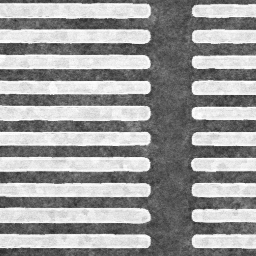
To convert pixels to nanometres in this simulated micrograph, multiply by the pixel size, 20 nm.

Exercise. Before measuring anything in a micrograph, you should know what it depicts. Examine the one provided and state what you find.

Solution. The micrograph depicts wiring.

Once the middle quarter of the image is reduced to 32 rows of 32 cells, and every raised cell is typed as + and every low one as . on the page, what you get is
+++++++++++++++++++++...........
................................
................................
................................
..........+++...................
+++++++++++++++++++++...........
+++++++++++++++++++++...........
................................
................................
................................
................................
+++++++++++++++++++++...........
+++++++++++++++++++++...........
+++++++++++++++++++++...........
................................
................................
................................
+++++++++++++++++++++...........
+++++++++++++++++++++...........
+++++++++++++++++++++...........
................................
................................
................................
.............++.................
+++++++++++++++++++++...........
+++++++++++++++++++++...........
+++++++++++++++++++++...........
................................
................................
................................
+++++++++++++++++++++...........
+++++++++++++++++++++...........